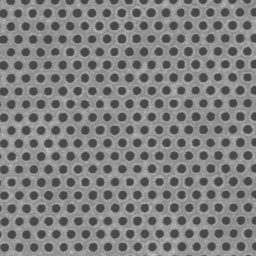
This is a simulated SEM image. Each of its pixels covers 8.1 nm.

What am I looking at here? a regular array of holes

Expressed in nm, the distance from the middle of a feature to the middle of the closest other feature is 119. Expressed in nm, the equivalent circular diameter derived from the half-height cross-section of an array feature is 74.2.